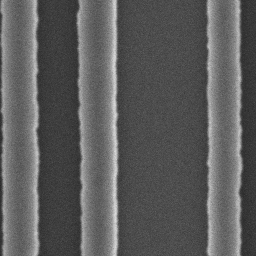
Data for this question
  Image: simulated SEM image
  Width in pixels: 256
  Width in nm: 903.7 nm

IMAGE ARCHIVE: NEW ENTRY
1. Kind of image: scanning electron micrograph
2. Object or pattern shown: lines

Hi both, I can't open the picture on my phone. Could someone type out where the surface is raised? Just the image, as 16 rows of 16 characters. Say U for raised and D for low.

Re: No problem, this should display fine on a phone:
UUDDDUUDDDDDDUUD
UUDDDUUDDDDDDUUD
UUDDDUUDDDDDDUUD
UUDDDUUDDDDDDUUD
UUDDDUUDDDDDDUUD
UUDDDUUDDDDDDUUD
UUDDDUUDDDDDDUUD
UUDDDUUDDDDDDUUD
UUDDDUUDDDDDDUUD
UUDDDUUDDDDDDUUD
UUDDDUUDDDDDDUUD
UUDDDUUDDDDDDUUD
UUDDDUUDDDDDDUUD
UUDDDUUDDDDDDUUD
UUDDDUUDDDDDDUUD
UUDDDUUDDDDDDUUD